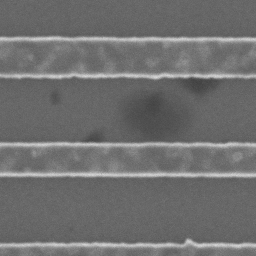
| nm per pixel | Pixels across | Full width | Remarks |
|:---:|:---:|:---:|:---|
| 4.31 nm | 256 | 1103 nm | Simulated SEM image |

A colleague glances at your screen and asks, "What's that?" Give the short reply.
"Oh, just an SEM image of one or a few lines or trenches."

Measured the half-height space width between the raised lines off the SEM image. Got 0.293 µm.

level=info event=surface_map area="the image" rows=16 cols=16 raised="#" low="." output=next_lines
................
................
################
################
################
................
................
................
................
################
################
................
................
................
................
################